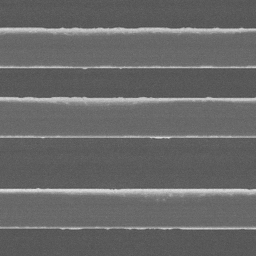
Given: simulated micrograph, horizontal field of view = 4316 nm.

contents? lines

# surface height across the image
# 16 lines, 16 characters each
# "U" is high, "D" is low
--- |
DDDDDDDDDDDDDDDD
DDDDDDDDDDDDDDDD
UUUUUUUUUUUUUUUU
UUUUUUUUUUUUUUUU
DDDDDDDDDDDDDDDD
DDDDDDDDDDDDDDDD
UUUUUUUUUUUUUUUU
UUUUUUUUUUUUUUUU
UUUUUUUUUUUUUUUU
DDDDDDDDDDDDDDDD
DDDDDDDDDDDDDDDD
DDDDDDDDDDDDDDDD
UUUUUUUUUUUUUUUU
UUUUUUUUUUUUUUUU
DDDDDDDDDDDDDDDD
DDDDDDDDDDDDDDDD